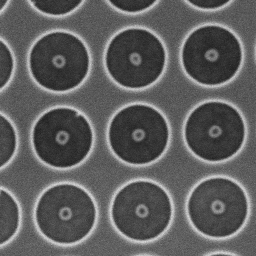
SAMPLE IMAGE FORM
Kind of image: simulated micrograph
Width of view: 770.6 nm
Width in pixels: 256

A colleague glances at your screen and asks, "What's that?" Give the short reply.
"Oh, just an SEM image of an array of small figures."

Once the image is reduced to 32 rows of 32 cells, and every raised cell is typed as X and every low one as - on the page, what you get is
-XXX------XXXX-----XXXXX----XXXX
XXXXX----XXXXXXX-XXXXXXXXXXXXXXX
XXXXXXXXXXXXXXXXXXXXXXXXXXXXXXXX
XXXXXXXXXXXXXXXXXXXXXXXXX---XXXX
XXXXX----XXXXX-----XXXXX-----XXX
-XXX------XXXX------XXX-------XX
-XXX-------XX--------XX---X---XX
--XX---X---XX--------XX-------XX
--XX-------XX-------XXX-------XX
-XXX-------XXX------XXXX-----XXX
-XXXX-----XXXXX----XXXXXX---XXXX
XXXXXXXXXXXXXXXXXXXXXXXXXXXXXXXX
XXXXXXXXXXXXXXXXXXXXXXXXXXXXXXXX
XXXXXXX-XXXXXXXX---XXXXXX----XXX
XXXXX-----XXXX------XXXX------XX
-XXX-------XXX-------XX-------XX
--XX--------XX---X---XX---X----X
--XX---X----XX-------XX--------X
--XX-------XXX-------XXX------XX
--XXX------XXXX-----XXXXX----XXX
-XXXXX----XXXXXX--XXXXXXXXXXXXXX
XXXXXXXXXXXXXXXXXXXXXXXXXXXXXXXX
XXXXXXXXXXXXXXXXXXXXXXXXXX---XXX
XXXXXX----XXXXX-----XXXX------XX
-XXXX------XXX-------XXX-------X
--XXX-------XX-------XX----X---X
--XX----X---XX---X---XXX-------X
--XXX-------XX-------XXX-------X
--XXX-------XXX------XXX------XX
--XXXX-----XXXXX----XXXXXX---XXX
XXXXXXXXXXXXXXXXXXXXXXXXXXXXXXXX
XXXXXXXXXXXXXXXXXXXXXXXXXXXXXXXX